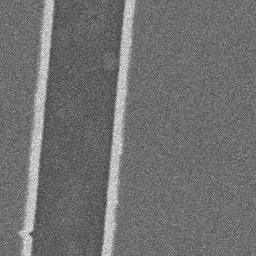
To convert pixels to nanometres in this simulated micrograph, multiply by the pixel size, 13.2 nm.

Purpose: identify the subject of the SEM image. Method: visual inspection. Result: one or a few lines or trenches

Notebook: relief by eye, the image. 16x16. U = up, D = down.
UUUDDDDDUUUUUUUU
UUUDDDDDUUUUUUUU
UUUDDDDDUUUUUUUU
UUUDDDDDUUUUUUUU
UUUDDDDDUUUUUUUU
UUUDDDDDUUUUUUUU
UUDDDDDUUUUUUUUU
UUDDDDDUUUUUUUUU
UUDDDDDUUUUUUUUU
UUDDDDDUUUUUUUUU
UUDDDDDUUUUUUUUU
UUDDDDDUUUUUUUUU
UUDDDDDUUUUUUUUU
UUDDDDDUUUUUUUUU
UUDDDDDUUUUUUUUU
UUDDDDDUUUUUUUUU